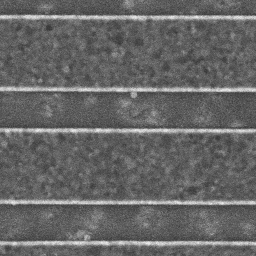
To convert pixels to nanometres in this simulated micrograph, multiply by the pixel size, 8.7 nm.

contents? one or a few lines or trenches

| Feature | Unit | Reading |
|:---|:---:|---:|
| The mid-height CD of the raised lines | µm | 0.627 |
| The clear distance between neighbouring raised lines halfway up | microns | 0.356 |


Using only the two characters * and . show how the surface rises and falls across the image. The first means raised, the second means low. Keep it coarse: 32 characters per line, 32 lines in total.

................................
................................
********************************
********************************
********************************
********************************
********************************
********************************
********************************
********************************
********************************
................................
................................
................................
................................
................................
********************************
********************************
********************************
********************************
********************************
********************************
********************************
********************************
********************************
................................
................................
................................
................................
................................
*****************....***********
********************************